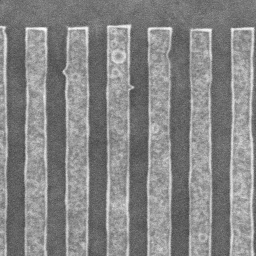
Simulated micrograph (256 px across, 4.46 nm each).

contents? parallel lines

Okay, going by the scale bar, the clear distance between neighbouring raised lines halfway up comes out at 90.3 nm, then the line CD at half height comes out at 93.6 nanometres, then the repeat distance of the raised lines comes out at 41.3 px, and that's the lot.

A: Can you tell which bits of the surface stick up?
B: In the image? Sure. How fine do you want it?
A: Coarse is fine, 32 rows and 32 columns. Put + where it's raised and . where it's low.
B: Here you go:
................................
................................
................................
..............++................
+..+++...++...++...++...++...+++
+..+++...++...++...++...++...+++
+..+++...++...++...++...++...++.
+..+++...++..+++...++...++...++.
+..+++..+++...++...++...++...++.
+..+++..+++...++...++...++...++.
+..+++..+++...++...++...++...++.
+..+++..+++..+++...++...++...++.
+..+++..+++..+++...++...++...++.
+..+++..+++..+++...++...++...++.
+..+++..+++..+++...++...++...++.
+..+++..+++..+++...++...++...++.
+..+++..+++...++...++...++...++.
+..+++..+++...++...++...++...++.
+..+++..+++...++...++...++...+++
+..+++..+++...++...++...++...+++
+..+++..+++...++...++...++...+++
+..+++..+++...++...++...++...+++
+..+++..+++...++...++...++...+++
+..+++..+++...++..+++...++...+++
+..+++..+++...++..+++...++...++.
+..+++..+++...++...++...++...++.
+..+++..+++...++...++...++...++.
+..+++..+++..+++...++...++...+++
+..+++..+++..+++...++...++...+++
+..+++..+++...++...++...++...+++
+..+++..+++...++...++...++...+++
+..+++..+++...++...++...++...+++